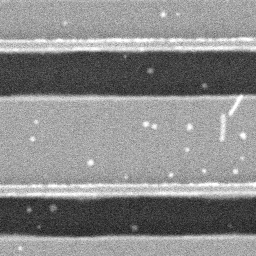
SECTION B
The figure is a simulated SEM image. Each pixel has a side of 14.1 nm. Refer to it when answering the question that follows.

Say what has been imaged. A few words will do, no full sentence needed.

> lines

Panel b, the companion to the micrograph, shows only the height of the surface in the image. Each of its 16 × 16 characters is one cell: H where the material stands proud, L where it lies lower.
HHHHHHHHHHHHHHHH
HHHHHHHHHHHHHHHH
HHHHHHHHHHHHHHHH
LLLLLLLLLLLLLLLL
LLLLLLLLLLLLLLLL
LLLLLLLLLLLLLLLL
HHHHHHHHHHHHHHHH
HHHHHHHHHHHHHHHH
HHHHHHHHHHHHHHHH
HHHHHHHHHHHHHHHH
HHHHHHHHHHHHHHHH
HHHHHHHHHHHHHHHH
LLLLLLLLLLLLLLLL
LLLLLLLLLLLLLLLL
LLLLLLLLLLLLLLLL
HHHHHHHHHHHHHHHH